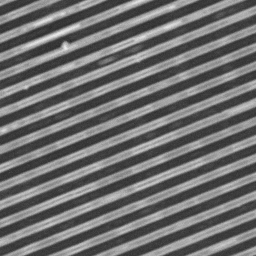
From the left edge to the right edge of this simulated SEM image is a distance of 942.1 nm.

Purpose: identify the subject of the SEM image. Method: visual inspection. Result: parallel lines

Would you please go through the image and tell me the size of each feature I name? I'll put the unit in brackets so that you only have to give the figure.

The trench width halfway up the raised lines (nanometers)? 37.1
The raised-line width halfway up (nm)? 24.8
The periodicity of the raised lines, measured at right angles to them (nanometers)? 63.2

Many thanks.